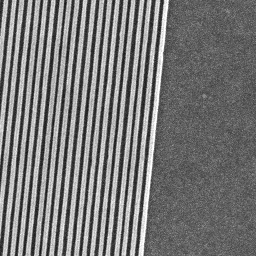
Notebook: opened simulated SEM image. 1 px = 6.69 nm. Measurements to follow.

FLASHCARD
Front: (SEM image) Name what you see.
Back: parallel lines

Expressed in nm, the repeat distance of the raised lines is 53.3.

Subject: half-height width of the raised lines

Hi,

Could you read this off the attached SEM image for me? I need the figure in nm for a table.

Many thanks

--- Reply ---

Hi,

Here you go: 28.3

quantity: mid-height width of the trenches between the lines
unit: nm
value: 28.3